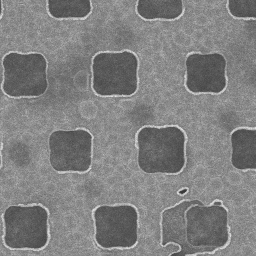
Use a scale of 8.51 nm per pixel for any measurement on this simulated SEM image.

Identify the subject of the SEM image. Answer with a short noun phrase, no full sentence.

holes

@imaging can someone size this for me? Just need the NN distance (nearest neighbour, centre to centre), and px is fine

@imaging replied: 88.4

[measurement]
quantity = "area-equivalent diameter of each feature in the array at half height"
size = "394 nanometers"